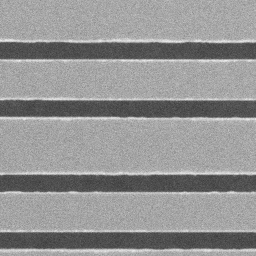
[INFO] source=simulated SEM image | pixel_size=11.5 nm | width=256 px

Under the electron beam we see lines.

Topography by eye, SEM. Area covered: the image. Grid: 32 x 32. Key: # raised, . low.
################################
################################
################################
################################
################################
................................
................................
................................
################################
################################
################################
################################
................................
................................
................................
################################
################################
################################
################################
################################
################################
################################
................................
................................
################################
################################
################################
################################
################################
................................
................................
################################